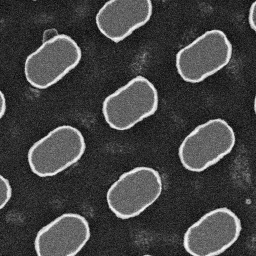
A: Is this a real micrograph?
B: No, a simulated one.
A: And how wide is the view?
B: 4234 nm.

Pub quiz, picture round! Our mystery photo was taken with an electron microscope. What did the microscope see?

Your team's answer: raised bodies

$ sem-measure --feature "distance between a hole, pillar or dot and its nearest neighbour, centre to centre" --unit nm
1440